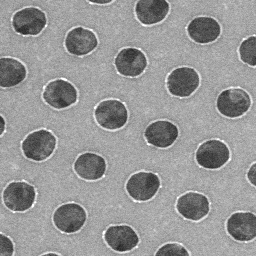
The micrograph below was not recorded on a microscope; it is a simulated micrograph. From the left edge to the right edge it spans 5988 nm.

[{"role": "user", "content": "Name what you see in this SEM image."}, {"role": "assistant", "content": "a regular array of raised bodies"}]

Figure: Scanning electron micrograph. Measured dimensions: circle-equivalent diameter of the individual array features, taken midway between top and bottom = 0.753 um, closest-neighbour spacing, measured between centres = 1.28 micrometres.